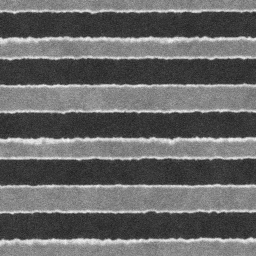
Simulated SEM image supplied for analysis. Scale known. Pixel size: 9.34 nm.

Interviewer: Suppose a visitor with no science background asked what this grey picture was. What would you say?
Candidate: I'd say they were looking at lines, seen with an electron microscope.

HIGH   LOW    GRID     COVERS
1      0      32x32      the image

11111111111111111111111111111111
11111111101110111111111010000000
00000000000000000000000000000000
00000000000000000000000000000000
00000000000000000000000000000000
11111111111111111111111111111111
11111111111111111111111111111111
00000000000000000000000000000000
00000000000000000000000000000000
00000000000000000000000000000000
00000000000000000000000000000000
11111111111111111111111111111111
11111111111111111111111111111111
11111111111111111111111111111111
00000000000000000000000000000000
00000000000000000000000000000000
00000000000000000000000000000000
11111111111111111111111111111111
11111111111111111111111111111111
11111111111111111111111111111111
00000000000000000000000000000000
00000000000000000000000000000000
00000000000000000000000000000000
11111111111111111111111111111111
11111111111111111111111111111111
11111111111111111111111111111111
11111111111111111100111100000000
00000000000000000000000000000000
00000000000000000000000000000000
00000000000000000000000000000000
11111111111111111111111111111111
11111111111111111111111111111111